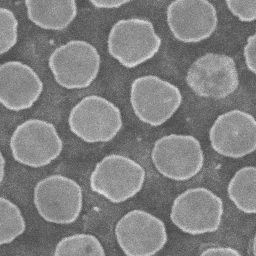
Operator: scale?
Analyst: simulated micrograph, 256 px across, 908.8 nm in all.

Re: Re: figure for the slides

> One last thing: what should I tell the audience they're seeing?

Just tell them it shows a regular array of raised bodies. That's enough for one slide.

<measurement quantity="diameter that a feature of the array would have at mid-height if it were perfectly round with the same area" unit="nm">170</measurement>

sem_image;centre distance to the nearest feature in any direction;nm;215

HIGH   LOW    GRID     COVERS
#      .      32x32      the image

...######...###.......####..####
#..######............######..###
##..#####.......#....######.....
##....##......#####..######.....
##............######..####......
##......###...######...........#
#......#####..#####............#
......######...###.............#
####..######...................#
#####..#####....................
#####..####......####...........
#####...........######..........
####......###...#######.........
.##......######..#####..........
.........######..####.......###.
...###...######....#.......#####
..#####..######...........######
.#######...###......####..######
.#######...........######..#####
..#####.......#....######....#..
...###......#####.#######.......
............#############.....##
......###..#######...........###
....######..######...........###
....######...###.......####..###
##..######............######..##
##...#####..##..##....######...#
###...###...########..#####.....
###.........#########..####.....
##.......############...........
.......#####...#####............
.......######...###.......###...